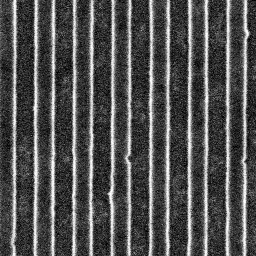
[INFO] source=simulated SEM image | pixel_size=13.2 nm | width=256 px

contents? parallel lines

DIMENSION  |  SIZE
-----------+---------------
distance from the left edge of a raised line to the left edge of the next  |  0.508 micrometres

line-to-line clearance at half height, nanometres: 268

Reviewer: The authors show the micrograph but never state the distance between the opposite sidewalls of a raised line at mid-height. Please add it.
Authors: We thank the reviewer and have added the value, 242 nm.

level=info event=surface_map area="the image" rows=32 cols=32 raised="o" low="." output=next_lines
oo..ooo..ooo..oo...oo...oo...oo.
oo...oo..ooo..oo...oo...oo...oo.
oo..ooo..ooo..oo...oo...oo...oo.
oo..ooo..oo...oo...oo...oo...oo.
oo..ooo..oo...oo...oo...oo...oo.
oo..ooo..oo...oo...oo...oo...oo.
oo..ooo..oo...oo...oo...oo...oo.
oo..ooo..oo...oo...oo...oo...oo.
oo..ooo..ooo..oo...oo...oo...oo.
oo..ooo..oo...oo...oo...oo...oo.
oo..ooo..oo...oo...oo...oo...oo.
oo...oo..ooo..oo...oo...oo...oo.
oo...oo..ooo..oo...oo...oo...oo.
oo..ooo..ooo..oo...oo...oo..ooo.
oo..ooo..oo...oo...oo...oo..ooo.
oo..ooo..oo...oo...oo...oo..ooo.
oo..ooo..ooo..oo...oo...oo..ooo.
oo...oo..ooo..oo...oo...oo..ooo.
oo...oo..oo...oo...oo...oo..ooo.
oo...oo..oo...oo...oo...oo..ooo.
oo...oo..oo...oo...oo...oo..ooo.
oo...oo..oo...oo...oo...oo..ooo.
oo...oo..oo...oo...oo...oo..ooo.
oo..ooo..oo...oo...oo...oo..ooo.
oo..ooo..oo...oo...oo...oo..ooo.
oo..ooo..oo...oo...oo...oo..ooo.
oo..ooo..oo...oo...oo...oo..ooo.
oo..ooo..oo...oo...oo...oo..ooo.
oo..ooo..oo...oo...oo...oo..ooo.
oo..ooo..oo...oo...oo...oo..ooo.
oo..ooo..oo...oo...oo...oo..ooo.
oo..ooo..oo...oo...oo...oo..ooo.